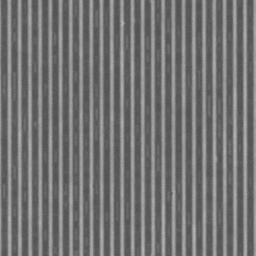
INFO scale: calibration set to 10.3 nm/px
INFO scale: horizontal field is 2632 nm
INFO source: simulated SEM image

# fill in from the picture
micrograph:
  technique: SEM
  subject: parallel lines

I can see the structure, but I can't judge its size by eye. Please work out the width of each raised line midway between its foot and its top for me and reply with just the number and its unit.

29.5 nanometres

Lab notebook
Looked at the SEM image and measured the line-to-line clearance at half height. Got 68.1 nanometres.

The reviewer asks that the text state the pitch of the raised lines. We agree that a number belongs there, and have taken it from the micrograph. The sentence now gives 105 nm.